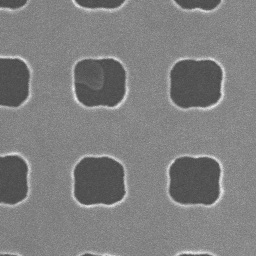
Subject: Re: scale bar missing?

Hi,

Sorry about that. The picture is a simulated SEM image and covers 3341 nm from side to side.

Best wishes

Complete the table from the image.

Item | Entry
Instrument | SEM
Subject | holes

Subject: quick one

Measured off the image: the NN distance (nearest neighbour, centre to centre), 1250 nm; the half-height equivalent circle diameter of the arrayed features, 701 nanometers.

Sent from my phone